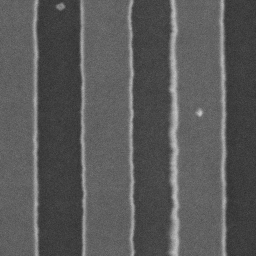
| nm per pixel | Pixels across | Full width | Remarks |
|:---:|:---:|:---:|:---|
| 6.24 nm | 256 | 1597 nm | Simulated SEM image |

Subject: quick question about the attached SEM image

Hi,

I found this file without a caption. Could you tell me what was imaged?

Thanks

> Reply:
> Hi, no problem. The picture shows lines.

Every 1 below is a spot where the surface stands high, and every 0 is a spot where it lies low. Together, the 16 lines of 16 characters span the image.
1100011100011100
1100011100011100
1100011100011100
1100011100011100
1100011100011100
1100011100011100
1100011100011100
1100011100011100
1100011100011100
1100011100011100
1100011100011100
1100011100011100
1100011100011100
1100011100011100
1100011100011100
1100011100011100